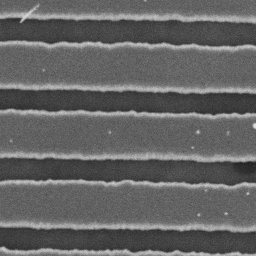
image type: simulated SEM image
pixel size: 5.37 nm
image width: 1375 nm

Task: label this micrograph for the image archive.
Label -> lines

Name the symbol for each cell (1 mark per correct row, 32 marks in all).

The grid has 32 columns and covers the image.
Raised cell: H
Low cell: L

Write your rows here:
HHHHHHHHHHHHHHHHHHHHHHHHHHHHHHHH
HHHHHHHHHHHHHHHHHHHHHHHHHHHHHHHH
LLLLLLLLLLLLLLLLLHLHHLHHHHHHHHHH
LLLLLLLLLLLLLLLLLLLLLLLLLLLLLLLL
LLLLLLLLLLLLLLLLLLLLLLLLLLLLLLLL
HHHHHHLHHHHHHLHHHHLLHLLLLLLLLLLL
HHHHHHHHHHHHHHHHHHHHHHHHHHHHHHHH
HHHHHHHHHHHHHHHHHHHHHHHHHHHHHHHH
HHHHHHHHHHHHHHHHHHHHHHHHHHHHHHHH
HHHHHHHHHHHHHHHHHHHHHHHHHHHHHHHH
HHHHHHHHHHHHHHHHHHHHHHHHHHHHHHHH
LLLLLLLLLLLLLLLLLLLLLLHHHHHHHHHH
LLLLLLLLLLLLLLLLLLLLLLLLLLLLLLLL
LLLLLLLLLLLLLLLLLLLLLLLLLLLLLLLL
HHHHHHHHHHHHHHHHHHHHHHHHHHHHHHHH
HHHHHHHHHHHHHHHHHHHHHHHHHHHHHHHH
HHHHHHHHHHHHHHHHHHHHHHHHHHHHHHHH
HHHHHHHHHHHHHHHHHHHHHHHHHHHHHHHH
HHHHHHHHHHHHHHHHHHHHHHHHHHHHHHHH
HHHHHHHHHHHHHHHHHHHHHHHHHHHHHHHH
LLLLLLLLLLLLLLLLLLLLLLLLLLLLLLLL
LLLLLLLLLLLLLLLLLLLLLLLLLLLLLLLL
LLLLLLHLLLLLLLLLLLLLLLLLLLLLLLLL
HHHHHHHHHHHHHHHHHHHHHHHHHHHHHHHH
HHHHHHHHHHHHHHHHHHHHHHHHHHHHHHHH
HHHHHHHHHHHHHHHHHHHHHHHHHHHHHHHH
HHHHHHHHHHHHHHHHHHHHHHHHHHHHHHHH
HHHHHHHHHHHHHHHHHHHHHHHHHHHHHHHH
LLLLLLLLLHHHHHHHHHHHHHHHHHHHHHHH
LLLLLLLLLLLLLLLLLLLLLLLLLLLLLLLL
LLLLLLLLLLLLLLLLLLLLLLLLLLLLLLLL
HHHHHHHHHHHHHHHHLHHHHHHLLLLLLLLL